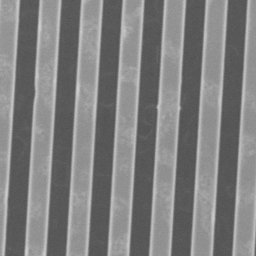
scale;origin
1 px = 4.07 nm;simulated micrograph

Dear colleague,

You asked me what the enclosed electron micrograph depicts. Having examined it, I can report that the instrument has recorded parallel lines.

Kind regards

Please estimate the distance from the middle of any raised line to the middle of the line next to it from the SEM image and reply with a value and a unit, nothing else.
169 nm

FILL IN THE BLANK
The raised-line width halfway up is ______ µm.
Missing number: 0.0864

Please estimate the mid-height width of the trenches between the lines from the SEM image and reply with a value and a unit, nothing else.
82.9 nm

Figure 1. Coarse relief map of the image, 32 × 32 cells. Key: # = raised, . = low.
##...##...###..###...##...##...#
##...##...###..###...##...##...#
##...##...###..###...##...##...#
##...##...###..###..###...##...#
##...##...##...###..###...##...#
##...##...##...###..###...##...#
##...##...##...###..###..###...#
##...##...##...##...###..###...#
##...##...##...##...###..###...#
##..###...##...##...###..###..##
##..###...##...##...###..###..##
##..###...##...##...##...###..##
##..###...##...##...##...###..##
##..###..###...##...##...###..##
#...###..###...##...##...##...##
#...###..###...##...##...##...##
#...###..###..###...##...##...##
#...##...###..###...##...##...##
#...##...###..###...##...##...##
#...##...###..###...##...##...##
#...##...###..###..###...##...##
#...##...##...###..###...##...##
#...##...##...###..###...##...##
#...##...##...###..###..###...##
#...##...##...##...###..###...##
#...##...##...##...###..###...##
#..###...##...##...###..###..###
#..###...##...##...##...###..###
#..###...##...##...##...###..###
#..###...##...##...##...###..###
#..###..###...##...##...###..###
...###..###...##...##...##...###